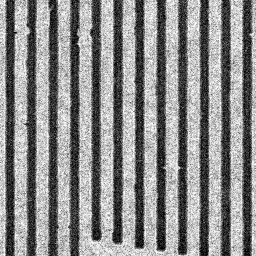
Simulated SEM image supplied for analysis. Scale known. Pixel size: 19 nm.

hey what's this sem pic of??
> parallel lines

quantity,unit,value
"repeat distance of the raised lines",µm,0.41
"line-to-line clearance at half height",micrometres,0.181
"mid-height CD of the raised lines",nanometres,235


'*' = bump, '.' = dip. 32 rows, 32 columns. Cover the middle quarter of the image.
**..***..***...***..***...**...*
**..***..***...***..***...**...*
**..***..***...***..***...**...*
**..***..***...***..***...**...*
**..***..***...***..***...**...*
**..***..***...***..***...**...*
**..***..***...***..***...**...*
**..***..***...***..***...**...*
**..***..***...***..***...**...*
**..***..***...***..***...**...*
**..***..***...***..***...***..*
**..***..***...***..***...***..*
**..***..***...***..***...***..*
**..***..***...***..***...**...*
**..***..***...***..***...**...*
**..***..***...***..***...**...*
**..***..***...***..***...**...*
**..***..***...***..***...**...*
**..***..***...***..***...**...*
*...***..***...**...***...**...*
*...***..***...**...***...***..*
*...***..***...***..***...***..*
**..***..***...***..***...**...*
**..***..***...**...***...**...*
**..***..***...**...***...**...*
**..***..***...**...***..****..*
*...***..***...***..***..****..*
*...***..***...***..***...**...*
*...***..***...***..***...**...*
*...***..***...***..***...**...*
*...***..***...**...***...**...*
*...***..***...**...***...**...*